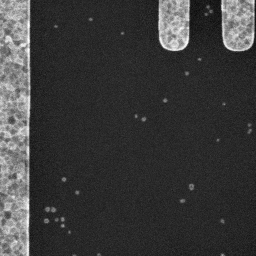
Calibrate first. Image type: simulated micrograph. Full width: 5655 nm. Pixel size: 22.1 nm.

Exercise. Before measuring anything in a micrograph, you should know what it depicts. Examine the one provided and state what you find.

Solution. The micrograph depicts wiring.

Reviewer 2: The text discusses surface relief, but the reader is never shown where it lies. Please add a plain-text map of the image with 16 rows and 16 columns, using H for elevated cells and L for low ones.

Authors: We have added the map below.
HHLLLLLLLLHHLLHH
HHLLLLLLLLHHLLHH
HHLLLLLLLLHHLLHH
HHLLLLLLLLLLLLLL
HHLLLLLLLLLLLLLL
HHLLLLLLLLLLLLLL
HHLLLLLLLLLLLLLL
HHLLLLLLLLLLLLLL
HHLLLLLLLLLLLLLL
HHLLLLLLLLLLLLLL
HHLLLLLLLLLLLLLL
HHLLLLLLLLLLLLLL
HHLLLLLLLLLLLLLL
HHLLLLLLLLLLLLLL
HHLLLLLLLLLLLLLL
HHLLLLLLLLLLLLLL